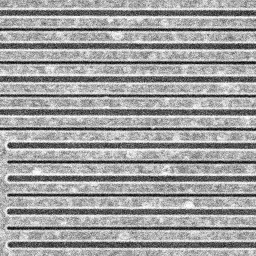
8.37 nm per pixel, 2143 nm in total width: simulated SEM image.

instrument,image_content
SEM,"parallel lines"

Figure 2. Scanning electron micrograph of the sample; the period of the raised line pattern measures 16.4 pixels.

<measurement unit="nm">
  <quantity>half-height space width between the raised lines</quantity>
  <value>58.6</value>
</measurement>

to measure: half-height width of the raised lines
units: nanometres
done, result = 88.9